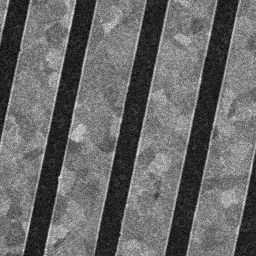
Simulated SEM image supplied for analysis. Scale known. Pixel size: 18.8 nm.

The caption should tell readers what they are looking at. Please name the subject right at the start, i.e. one or a few lines or trenches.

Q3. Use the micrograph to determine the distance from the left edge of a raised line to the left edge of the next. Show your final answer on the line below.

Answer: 1300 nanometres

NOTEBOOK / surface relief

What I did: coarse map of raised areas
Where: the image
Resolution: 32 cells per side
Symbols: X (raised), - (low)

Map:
X---XXXXX---XXXXXX---XXXXXX---XX
X---XXXXX---XXXXXX---XXXXXX---XX
X--XXXXXX---XXXXXX---XXXXXX--XXX
---XXXXXX--XXXXXXX--XXXXXX---XXX
---XXXXXX--XXXXXX---XXXXXX---XXX
---XXXXX---XXXXXX---XXXXXX---XXX
---XXXXX---XXXXXX---XXXXXX---XXX
--XXXXXX---XXXXXX---XXXXX---XXXX
--XXXXXX--XXXXXX---XXXXXX---XXXX
--XXXXX---XXXXXX---XXXXXX---XXXX
--XXXXX---XXXXXX---XXXXXX---XXXX
-XXXXXX---XXXXXX---XXXXXX---XXXX
-XXXXXX---XXXXXX---XXXXXX--XXXXX
-XXXXXX--XXXXXX---XXXXXX---XXXXX
-XXXXX---XXXXXX---XXXXXX---XXXXX
-XXXXX---XXXXXX---XXXXXX---XXXXX
XXXXXX---XXXXXX---XXXXXX---XXXXX
XXXXXX---XXXXXX---XXXXXX--XXXXXX
XXXXXX--XXXXXX---XXXXXX---XXXXXX
XXXXX---XXXXXX---XXXXXX---XXXXXX
XXXXX---XXXXXX---XXXXXX---XXXXX-
XXXXX---XXXXXX---XXXXXX---XXXXX-
XXXXX--XXXXXXX--XXXXXX---XXXXXX-
XXXXX--XXXXXX---XXXXXX---XXXXXX-
XXXX---XXXXXX---XXXXXX---XXXXXX-
XXXX---XXXXXX---XXXXXX---XXXXXX-
XXXX---XXXXXX---XXXXXX---XXXXX--
XXXX--XXXXXXX--XXXXXX---XXXXXX--
XXXX--XXXXXX---XXXXXX---XXXXXX--
XXX---XXXXXX---XXXXXX---XXXXXX--
XXX---XXXXXX---XXXXXX---XXXXX---
XXX---XXXXXX---XXXXXX--XXXXXX---